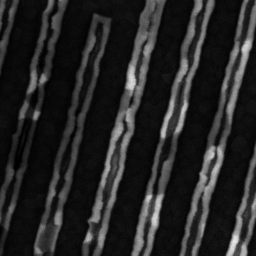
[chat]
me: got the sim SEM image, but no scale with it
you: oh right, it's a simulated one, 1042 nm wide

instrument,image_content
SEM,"parallel lines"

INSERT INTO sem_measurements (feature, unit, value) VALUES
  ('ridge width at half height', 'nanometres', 73.1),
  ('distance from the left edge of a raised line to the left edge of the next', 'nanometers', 192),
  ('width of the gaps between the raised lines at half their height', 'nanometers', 121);